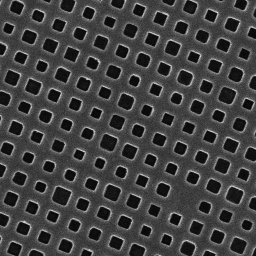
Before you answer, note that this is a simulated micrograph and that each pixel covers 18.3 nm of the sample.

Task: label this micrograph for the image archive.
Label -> a regular array of holes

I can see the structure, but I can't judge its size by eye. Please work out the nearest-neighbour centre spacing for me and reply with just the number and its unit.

406 nanometers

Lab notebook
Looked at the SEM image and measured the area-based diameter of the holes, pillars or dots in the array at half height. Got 229 nanometers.